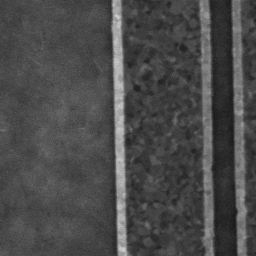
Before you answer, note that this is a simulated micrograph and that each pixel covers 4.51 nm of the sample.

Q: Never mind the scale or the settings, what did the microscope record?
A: one or a few lines or trenches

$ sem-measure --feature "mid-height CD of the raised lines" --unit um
0.395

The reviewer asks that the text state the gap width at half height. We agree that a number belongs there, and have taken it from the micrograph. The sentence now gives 0.147 micrometres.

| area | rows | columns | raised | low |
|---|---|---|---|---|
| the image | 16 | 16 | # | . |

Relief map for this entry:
.......######..#
.......######..#
.......######..#
.......######..#
.......######..#
.......######..#
.......######..#
.......######..#
.......######..#
........#####..#
........#####..#
........#####..#
........#####..#
........#####..#
........#####..#
........#####..#